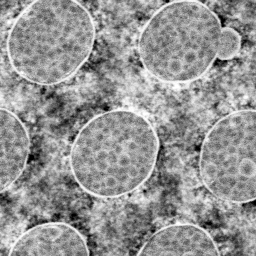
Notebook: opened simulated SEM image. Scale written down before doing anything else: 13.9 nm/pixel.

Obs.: raised bodies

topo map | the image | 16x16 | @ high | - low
--@@@-----@@@---
-@@@@@---@@@@@--
-@@@@@---@@@@@@-
-@@@@----@@@@@--
-@@@@----@@@@---
----------------
----------------
@-----@@@-----@@
@@---@@@@@---@@@
@@---@@@@@---@@@
@----@@@@@---@@@
@----@@@@----@@@
--------------@@
----------------
--@@@-----@@@---
-@@@@----@@@@@--